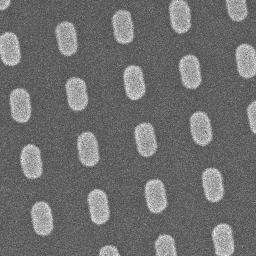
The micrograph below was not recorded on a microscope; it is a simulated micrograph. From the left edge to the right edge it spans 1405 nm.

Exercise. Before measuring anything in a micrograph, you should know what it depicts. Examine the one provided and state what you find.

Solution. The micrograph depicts a regular array of raised bodies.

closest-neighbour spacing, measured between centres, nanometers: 313